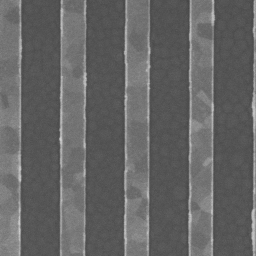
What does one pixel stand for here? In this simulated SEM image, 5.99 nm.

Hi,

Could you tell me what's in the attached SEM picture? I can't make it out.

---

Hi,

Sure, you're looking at one or a few lines or trenches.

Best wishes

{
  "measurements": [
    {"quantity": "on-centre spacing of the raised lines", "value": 0.384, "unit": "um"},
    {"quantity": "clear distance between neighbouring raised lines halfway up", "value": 240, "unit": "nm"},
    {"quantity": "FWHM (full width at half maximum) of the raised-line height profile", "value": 145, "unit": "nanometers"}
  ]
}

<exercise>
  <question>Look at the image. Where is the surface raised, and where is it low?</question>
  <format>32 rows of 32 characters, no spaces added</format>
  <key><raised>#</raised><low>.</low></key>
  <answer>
###.....###.....###.....###.....
###.....###.....###.....###.....
###.....###.....###.....###.....
###.....###.....###.....###.....
###.....###.....###.....###.....
###.....###.....###.....###.....
###.....###.....###.....###.....
###.....###.....###.....###.....
###.....###.....###.....###.....
###.....###.....###.....###.....
###.....###.....###.....###.....
###.....###.....###.....###.....
###.....###.....###.....###.....
###.....###.....###.....###.....
###.....###.....###.....###.....
###.....###.....###.....###.....
###....####.....###.....###.....
###....####.....###.....###.....
###.....###.....###.....###.....
###.....###.....###.....###.....
###.....###.....###.....###.....
###.....###.....###.....###.....
###.....###.....##......###.....
##......###.....##......###.....
##......###.....###.....###.....
##......###.....###.....###.....
##......###.....###.....###....#
##......###.....###.....###....#
##......###.....###.....###....#
##......###.....##......###....#
##......###.....##......###.....
##......###.....##......###.....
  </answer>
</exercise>